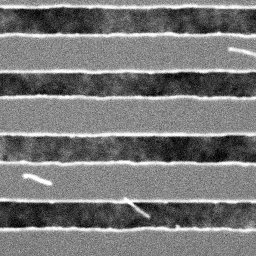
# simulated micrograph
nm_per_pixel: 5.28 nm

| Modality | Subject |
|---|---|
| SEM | lines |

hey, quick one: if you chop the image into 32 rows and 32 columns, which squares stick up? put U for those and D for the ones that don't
UUUUUUUUUUUUUUUUUUUUUUUUUUUUUUUU
DDDDDDDDDDDDDDDDDDDDDDDDDDDDDDDD
DDDDDDDDDDDDDDDDDDDDDDDDDDDDDDDD
DDDDDDDDDDDDDDDDDDDDDDDDDDDDDDDD
UUUUUUUUUUUUUUUUUUUUUUUUUUUUUUUU
UUUUUUUUUUUUUUUUUUUUUUUUUUUUUUUU
UUUUUUUUUUUUUUUUUUUUUUUUUUUUUUUU
UUUUUUUUUUUUUUUUUUUUUUUUUUUUUUUU
UUUUUUUUUUUUUUUUUUUUUUUUUUUUUUUU
DDDDDDDDDDDDDDDDDDDDDDDDDDDDDDDD
DDDDDDDDDDDDDDDDDDDDDDDDDDDDDDDD
DDDDDDDDDDDDDDDDDDDDDDDDDDDDDDDD
UUUUUUUUUUUUUUUUUUUUUUUUUUUUUUUU
UUUUUUUUUUUUUUUUUUUUUUUUUUUUUUUU
UUUUUUUUUUUUUUUUUUUUUUUUUUUUUUUU
UUUUUUUUUUUUUUUUUUUUUUUUUUUUUUUU
UUUUUUUUUUUUUUUUUUUUUUUUUUUUUUUU
DDDDDDDDDDDDDDDDDDDDDDDDDDDDDDDD
DDDDDDDDDDDDDDDDDDDDDDDDDDDDDDDD
DDDDDDDDDDDDDDDDDDDDDDDDDDDDDDDD
UUUUUUUUUUUUUUUUUUUUUUUUUUUUUUUU
UUUUUUUUUUUUUUUUUUUUUUUUUUUUUUUU
UUUUUUUUUUUUUUUUUUUUUUUUUUUUUUUU
UUUUUUUUUUUUUUUUUUUUUUUUUUUUUUUU
UUUUUUUUUUUUUUUUUUUUUUUUUUUUUUUU
DDDDDDDDDDDDDDDDDDDDDDDDDDDDDDDD
DDDDDDDDDDDDDDDDDDDDDDDDDDDDDDDD
DDDDDDDDDDDDDDDDDDDDDDDDDDDDDDDD
DDDUUUUUUUDDDDDDDUUUUDDDUDDDDDDD
UUUUUUUUUUUUUUUUUUUUUUUUUUUUUUUU
UUUUUUUUUUUUUUUUUUUUUUUUUUUUUUUU
UUUUUUUUUUUUUUUUUUUUUUUUUUUUUUUU